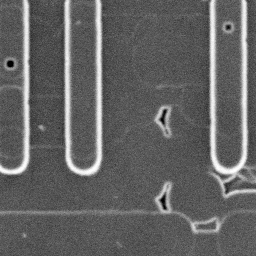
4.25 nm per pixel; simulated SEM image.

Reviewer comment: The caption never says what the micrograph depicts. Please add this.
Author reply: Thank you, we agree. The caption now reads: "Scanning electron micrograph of wiring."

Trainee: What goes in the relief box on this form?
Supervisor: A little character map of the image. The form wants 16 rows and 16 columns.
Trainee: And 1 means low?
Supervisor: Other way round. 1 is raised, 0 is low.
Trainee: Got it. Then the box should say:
1100110000000110
1100110000000110
1100110000000110
1100110000000110
1100110000000110
1100110000000110
1100110000000110
1100110000000110
1100110000000110
1100110000000110
1000010000000010
0000000000000000
0000000000000000
0000000000000000
0000000000000000
0000000000000000